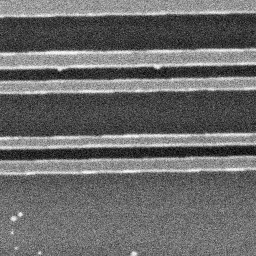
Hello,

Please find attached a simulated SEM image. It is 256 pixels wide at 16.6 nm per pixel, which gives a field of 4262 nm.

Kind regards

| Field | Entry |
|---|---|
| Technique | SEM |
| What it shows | lines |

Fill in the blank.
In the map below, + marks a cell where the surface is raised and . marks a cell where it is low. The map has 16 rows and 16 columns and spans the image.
++++++++++++++++
................
................
++++++++++++++++
++++++++++++++++
++++++++++++++++
................
................
.........+.+++++
++++++++++++++++
++++++++++++++++
................
................
................
................
................